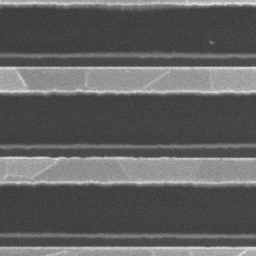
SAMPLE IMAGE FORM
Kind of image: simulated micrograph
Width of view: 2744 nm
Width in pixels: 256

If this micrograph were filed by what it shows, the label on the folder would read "lines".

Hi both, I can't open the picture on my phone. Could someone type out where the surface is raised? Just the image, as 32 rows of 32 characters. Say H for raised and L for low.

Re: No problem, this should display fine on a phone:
LLHLLLLHHLLLLHHHHHHLLLHHHHHHHHHH
LLLLLLLLLLLLLLLLLLLLLLLLLLLLLLLL
LLLLLLLLLLLLLLLLLLLLLLLLLLLLLLLL
LLLLLLLLLLLLLLLLLLLLLLLLLLLLLLLL
LLLLLLLLLLLLLLLLLLLLLLLLLLLLLLLL
LLLLLLLLLLLLLLLLLLLLLLLLLLLLLLLL
LLLLLLLLLLLLLLLLLLLLLLLLLLLLLLLL
LLLLLLLLLLLLLLLLLLLLLLLLLLLLLLLL
HHHHHHHHHHHHHHHHHHHHHHHHHHHHHHHH
HHHHHHHHHHHHHHHHHHHHHHHHHHHHHHHH
HHHHHHHHHHHHHHHHHHHHHHHHHHHHHHHH
LHLLLHLLLLLLHLHHHHHHHLLLLHHHLHHH
LLLLLLLLLLLLLLLLLLLLLLLLLLLLLLLL
LLLLLLLLLLLLLLLLLLLLLLLLLLLLLLLL
LLLLLLLLLLLLLLLLLLLLLLLLLLLLLLLL
LLLLLLLLLLLLLLLLLLLLLLLLLLLLLLLL
LLLLLLLLLLLLLLLLLLLLLLLLLLLLLLLL
LLLLLLLLLLLLLLLLLLLLLLLLLLLLLLLL
LLLLLLLLLLLLLLLLLLLLLLLLLLLLLLLL
LLLLLLLLLLLLLLLLLLLLLLLLLLLLLLLL
HHHHHHHHHHHHHHHHHHHHHHHHHHHHHHHH
HHHHHHHHHHHHHHHHHHHHHHHHHHHHHHHH
HHHHHHHHHHHHHHHHHHHHHHHHHHHHHHHH
LLLLLLLLLLLLLLLLLLLLLLLLLLLLLLLL
LLLLLLLLLLLLLLLLLLLLLLLLLLLLLLLL
LLLLLLLLLLLLLLLLLLLLLLLLLLLLLLLL
LLLLLLLLLLLLLLLLLLLLLLLLLLLLLLLL
LLLLLLLLLLLLLLLLLLLLLLLLLLLLLLLL
LLLLLLLLLLLLLLLLLLLLLLLLLLLLLLLL
LLLLLLLLLLLLLLLLLLLLLLLLLLLLLLLL
LLLLLLLLLLLLLLLLLLLLLLLLLLLLLLLL
HHHHHHHHHHHHHHHHHHHHHHHHHHHHHHHH